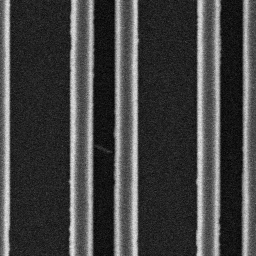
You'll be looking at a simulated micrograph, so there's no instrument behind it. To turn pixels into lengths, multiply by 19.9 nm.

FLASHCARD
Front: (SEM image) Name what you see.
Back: lines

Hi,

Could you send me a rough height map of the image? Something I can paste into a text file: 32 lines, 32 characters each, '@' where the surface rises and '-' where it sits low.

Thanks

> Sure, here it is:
@--------@@@---@@--------@@----@
@--------@@@---@@--------@@----@
@--------@@@---@@--------@@----@
@--------@@@---@@--------@@----@
@--------@@@---@@--------@@----@
@--------@@@---@@--------@@----@
@--------@@@---@@--------@@----@
@--------@@@---@@--------@@----@
@--------@@@---@@--------@@----@
@--------@@@---@@--------@@----@
@--------@@----@@--------@@----@
@--------@@----@@--------@@----@
@--------@@----@@--------@@----@
@--------@@----@@--------@@----@
@--------@@----@@--------@@----@
@--------@@----@@--------@@----@
@--------@@----@@--------@@----@
@--------@@----@@--------@@----@
@--------@@----@@--------@@----@
@--------@@----@@--------@@----@
@--------@@----@@--------@@----@
@--------@@----@@--------@@----@
@--------@@----@@--------@@----@
@--------@@---@@@--------@@----@
@--------@@---@@@--------@@----@
@--------@@---@@@--------@@----@
@--------@@---@@@--------@@----@
@--------@@---@@@--------@@----@
@--------@@----@@--------@@---@@
@--------@@---@@@--------@@---@@
@--------@@---@@@--------@@---@@
@--------@@---@@@--------@@---@@